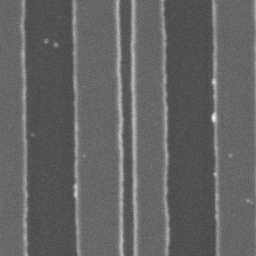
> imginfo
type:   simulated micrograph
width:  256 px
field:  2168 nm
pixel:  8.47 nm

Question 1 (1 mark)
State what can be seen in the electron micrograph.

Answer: lines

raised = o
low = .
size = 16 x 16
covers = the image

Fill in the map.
oo...ooooo...ooo
oo...ooooo...ooo
oo...ooooo...ooo
oo...ooooo...ooo
oo...ooooo...ooo
oo...ooooo...ooo
oo...ooooo...ooo
oo...ooooo...ooo
oo...ooooo...ooo
oo...ooooo...ooo
oo...ooooo...ooo
oo...ooooo....oo
oo...ooooo....oo
oo...ooooo....oo
oo...oooooo...oo
oo...oooooo...oo